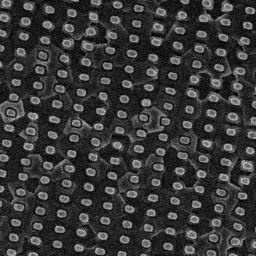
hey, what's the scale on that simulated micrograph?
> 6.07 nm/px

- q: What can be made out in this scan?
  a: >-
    a regular array of raised bodies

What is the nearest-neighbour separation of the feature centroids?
91.9 nanometers